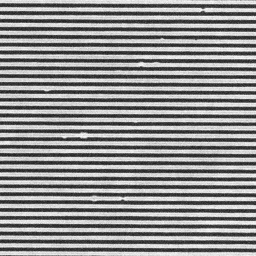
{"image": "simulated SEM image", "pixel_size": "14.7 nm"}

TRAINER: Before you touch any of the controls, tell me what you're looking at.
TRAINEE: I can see parallel lines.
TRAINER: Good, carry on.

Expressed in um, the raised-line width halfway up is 0.0441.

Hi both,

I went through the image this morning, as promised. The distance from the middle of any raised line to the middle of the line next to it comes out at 116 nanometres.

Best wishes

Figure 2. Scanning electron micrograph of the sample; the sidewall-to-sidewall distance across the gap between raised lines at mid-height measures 71.7 nm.